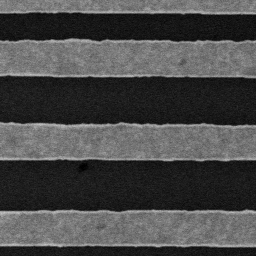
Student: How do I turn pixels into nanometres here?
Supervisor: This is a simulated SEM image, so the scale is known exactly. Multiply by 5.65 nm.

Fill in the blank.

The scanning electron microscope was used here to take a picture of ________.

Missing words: lines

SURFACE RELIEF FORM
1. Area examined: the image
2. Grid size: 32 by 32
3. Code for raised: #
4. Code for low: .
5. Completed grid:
################################
####..#.#.######################
................................
................................
................................
################################
################################
################################
################################
......#############.############
................................
................................
................................
................................
................................
#######.......###........#......
################################
################################
################################
################################
................................
................................
................................
................................
................................
................................
################################
################################
################################
################################
################################
................................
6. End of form